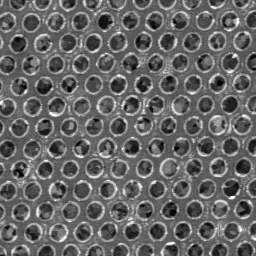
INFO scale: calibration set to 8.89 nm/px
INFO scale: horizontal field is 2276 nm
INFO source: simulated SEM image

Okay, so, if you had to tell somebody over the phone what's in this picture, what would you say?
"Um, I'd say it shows a regular array of raised bodies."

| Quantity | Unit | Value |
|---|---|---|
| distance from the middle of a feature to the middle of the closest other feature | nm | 212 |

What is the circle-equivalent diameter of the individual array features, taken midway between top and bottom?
0.158 µm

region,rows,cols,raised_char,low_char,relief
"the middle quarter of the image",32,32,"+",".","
..++++..++++...++++..++++..++++.
...+++...+++...+++....++....++..
................................
++....+++...+++....++....+++...+
+++...+++...++++..++++..++++..++
+++..++++...++++..++++..++++..++
+++...+++...+++...+++....+++...+
................................
.........+++....++....++....+++.
...+++...++++..++++..++++..++++.
...+++...++++..++++..++++..++++.
...+++...+++...++++..++++..++++.
...++...........+...............
.......++..........++.....+.....
+++...++++..+++...++++..++++...+
+++...++++..+++...++++..++++..++
+++...+++...+++...++++..++++..++
+++...+++...+++................+
................................
...+++...+++....+++...+++...+++.
...+++...++++..++++..++++..++++.
..++++...++++..++++..++++..++++.
...+++...+++...+++....++....+++.
................................
.++...+++....++....+++...+++...+
+++...++++..++++..++++..+++++.++
+++...++++..++++..++++..++++...+
+++...+++...+++....++....+++...+
................................
....+...........++.....+.....++.
...+++...++++..++++...+++...+++.
+..++++..++++..++++..++++...+++.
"